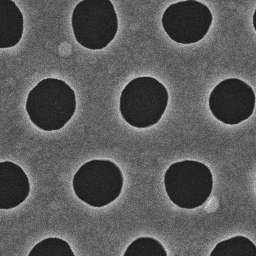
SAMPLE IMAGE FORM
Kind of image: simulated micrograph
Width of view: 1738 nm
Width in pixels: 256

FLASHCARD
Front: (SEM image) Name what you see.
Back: holes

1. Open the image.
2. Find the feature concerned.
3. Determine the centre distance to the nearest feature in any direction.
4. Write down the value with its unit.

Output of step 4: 617 nm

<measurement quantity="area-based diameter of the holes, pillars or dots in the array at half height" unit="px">49.3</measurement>